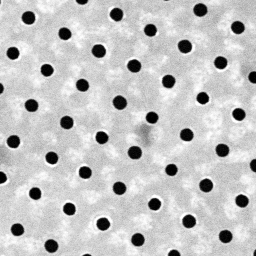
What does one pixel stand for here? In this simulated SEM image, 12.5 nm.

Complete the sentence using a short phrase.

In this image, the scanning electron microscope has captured a regular array of holes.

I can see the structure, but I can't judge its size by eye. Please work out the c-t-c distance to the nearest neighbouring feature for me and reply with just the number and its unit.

0.475 um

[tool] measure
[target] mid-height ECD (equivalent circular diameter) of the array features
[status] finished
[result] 174 nm